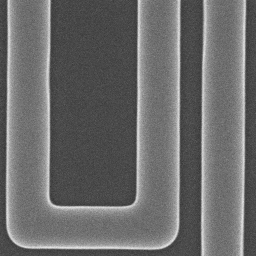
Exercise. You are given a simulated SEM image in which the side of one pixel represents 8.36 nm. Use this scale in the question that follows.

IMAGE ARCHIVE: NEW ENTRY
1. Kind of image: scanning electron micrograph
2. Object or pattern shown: groups of lines, slits or small figures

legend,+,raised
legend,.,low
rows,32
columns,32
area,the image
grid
.+++++...........+++++....+++++.
.+++++...........+++++....+++++.
.+++++...........+++++....+++++.
.+++++...........+++++....+++++.
.+++++...........+++++....++++..
.+++++...........+++++....++++..
.+++++...........+++++...+++++..
.+++++...........+++++...+++++..
.+++++...........+++++...+++++..
.+++++...........+++++...+++++..
.+++++...........+++++...+++++..
.+++++...........+++++...+++++..
.+++++...........+++++...+++++..
.+++++...........+++++...+++++..
.+++++...........+++++...+++++..
.+++++...........+++++...+++++..
.+++++...........+++++...+++++..
.+++++...........+++++...+++++..
.+++++...........+++++...+++++..
.+++++...........+++++...+++++..
.+++++...........+++++...+++++..
.+++++...........+++++...+++++..
.+++++...........+++++...+++++..
.+++++...........+++++...+++++..
.+++++...........+++++...+++++..
.++++++.........++++++...+++++..
.+++++++++++++++++++++...+++++..
.+++++++++++++++++++++...+++++..
.+++++++++++++++++++++...+++++..
.+++++++++++++++++++++...+++++..
..+++++++++++++++++++....+++++..
.........................+++++..